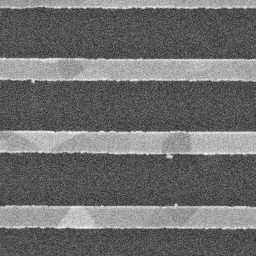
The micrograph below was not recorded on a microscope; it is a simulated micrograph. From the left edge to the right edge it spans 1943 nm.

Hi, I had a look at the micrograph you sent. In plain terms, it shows lines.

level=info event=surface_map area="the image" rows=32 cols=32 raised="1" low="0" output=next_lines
11111111111111111111111111111111
00000000000000000000000000000000
00000000000000000000000000000000
00000000000000000000000000000000
00000000000000000000000000000000
00000000000000000000000000000000
00000000000000000000000000000000
11111111111011000100000000000000
11111111111111111111111111111111
11111111111111111111111111111111
00000000000000000000000000000000
00000000000000000000000000000000
00000000000000000000000000000000
00000000000000000000000000000000
00000000000000000000000000000000
00000000000000000000000000000000
11111111101011101100011000000000
11111111111111111111111111111111
11111111111111111111111111111111
00000000000000000000000000000000
00000000000000000000000000000000
00000000000000000000000000000000
00000000000000000000000000000000
00000000000000000000000000000000
00000000000000000000000000000000
00000000000000000000000000000000
11111111111111111111111111111111
11111111111111111111111111111111
00000000000000010000000001011110
00000000000000000000000000000000
00000000000000000000000000000000
00000000000000000000000000000000